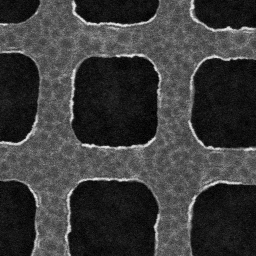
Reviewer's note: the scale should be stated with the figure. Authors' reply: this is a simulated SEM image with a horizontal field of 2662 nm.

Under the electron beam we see holes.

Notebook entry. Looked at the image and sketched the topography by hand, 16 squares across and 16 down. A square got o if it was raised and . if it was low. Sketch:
..ooo.....oo....
ooooooo.ooooo...
oooooooooooooooo
..oooooooooooooo
..ooo.....oo....
..ooo.....oo....
..ooo.....oo....
..ooo.....oo....
..ooo.....oo....
oooooooooooooooo
oooooooooooooooo
.oooo....ooooo.o
..oo......oo....
..oo......oo....
..oo......oo....
..oo......oo....